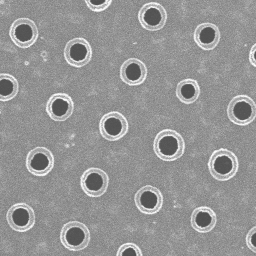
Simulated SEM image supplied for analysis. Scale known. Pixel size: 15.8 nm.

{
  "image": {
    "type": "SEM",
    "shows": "a regular array of ring-shaped raised bodies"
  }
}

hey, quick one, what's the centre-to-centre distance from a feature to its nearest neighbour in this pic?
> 0.902 microns